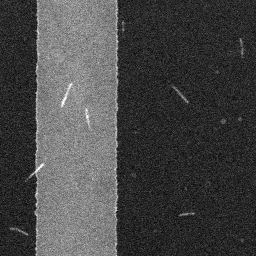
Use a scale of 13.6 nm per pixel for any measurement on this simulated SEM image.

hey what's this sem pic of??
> one or a few lines or trenches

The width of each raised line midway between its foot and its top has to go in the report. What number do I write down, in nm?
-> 1090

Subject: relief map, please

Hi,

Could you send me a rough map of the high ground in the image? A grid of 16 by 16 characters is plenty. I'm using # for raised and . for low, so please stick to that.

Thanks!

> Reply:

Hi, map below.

..#####.........
..#####.........
..#####.........
..#####.........
..#####.........
..#####.........
..#####.........
..#####.........
..#####.........
..#####.........
..#####.........
..#####.........
..#####.........
..#####.........
..#####.........
..#####.........